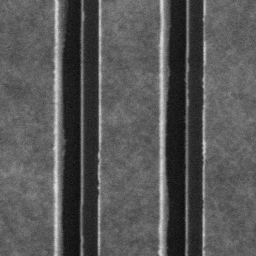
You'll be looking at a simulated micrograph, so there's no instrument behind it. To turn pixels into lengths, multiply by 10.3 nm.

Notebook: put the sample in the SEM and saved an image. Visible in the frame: lines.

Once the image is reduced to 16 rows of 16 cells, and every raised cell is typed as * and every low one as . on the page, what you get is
****..****...***
****..****...***
****..****...***
****..****...***
****..****...***
****..****...***
****..****...***
****..****...***
****..****...***
****..****...***
****..****...***
****..****...***
****..****...***
****..****...***
****..****...***
****..****...***